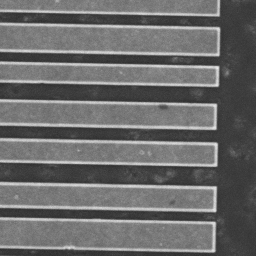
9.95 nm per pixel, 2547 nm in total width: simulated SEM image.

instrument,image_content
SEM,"parallel lines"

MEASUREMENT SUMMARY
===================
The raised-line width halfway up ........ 232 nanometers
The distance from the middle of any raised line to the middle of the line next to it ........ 388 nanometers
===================